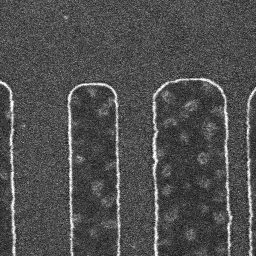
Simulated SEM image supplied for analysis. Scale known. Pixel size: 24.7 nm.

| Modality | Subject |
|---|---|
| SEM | one or a few lines or trenches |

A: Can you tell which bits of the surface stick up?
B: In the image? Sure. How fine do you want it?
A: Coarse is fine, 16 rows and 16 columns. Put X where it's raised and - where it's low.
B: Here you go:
----------------
----------------
----------------
----------------
----------------
-----XX---XXXX--
X---XXX---XXXX--
X---XXX---XXXX--
X---XXX---XXXX-X
X---XXX---XXXX-X
X---XXX---XXXX--
X---XXX---XXXX--
X---XXX---XXXX--
X---XXX---XXXX--
X---XXX---XXXX--
X---XXX---XXXX--